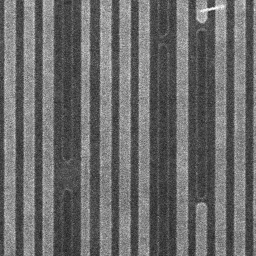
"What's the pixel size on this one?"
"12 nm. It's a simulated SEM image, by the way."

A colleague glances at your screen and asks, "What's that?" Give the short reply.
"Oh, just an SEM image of parallel lines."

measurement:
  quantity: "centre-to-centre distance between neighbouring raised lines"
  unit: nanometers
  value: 230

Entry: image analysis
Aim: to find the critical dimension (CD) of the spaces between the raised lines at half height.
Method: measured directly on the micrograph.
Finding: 0.112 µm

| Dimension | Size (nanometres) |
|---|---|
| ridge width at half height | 124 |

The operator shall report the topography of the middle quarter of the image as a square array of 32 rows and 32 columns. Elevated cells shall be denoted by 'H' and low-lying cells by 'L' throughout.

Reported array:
HHLLLHLLLHHHLLHHLLLHHLLLHHLLLHHL
HHLLLHLLLHHHLLHHLLLHHLLLHHLLLHHL
HHLLLHLLLHHHLLHHLLLHHLLLHHLLLHHL
HHLLLHLLLHHHLLHHLLLHHLLLHHLLLHHL
HHLLLHLLLHHHLLHHLLLHHLLLHHLLLHHL
HHLLLHLLLHHHLLHHLLLHHLLLHHLLLHHL
HHLLLHLLLHHHLLHHLLLHHLLLHHLLLHHL
HHLLHHLLLHHHLLHHLLLHHLLLHHLLHHHL
HHLLHHLLLHHHLLHHLLLHHLLLHHLLHHHL
HHLLHHLLLHHHLLHHLLLHHLLLHHLLHHHL
HHLLHHLLLHHHLLHHLLLHHLLLHHLLHHHL
HHLLHHLLLHHHLLHHLLLHHLLLHHLLHHHL
HHLLHHLLLHHHLLHHLLLHHLLLHHLLHHHL
HHLLHHLLLHHHLLHHLLLHHLLLHHLLHHHL
HHLLHHLLLHHHLLHHLLLHHLLLHHLLHHHL
HHLLHHLLLHHHLLHHLLLHHLLLHHLLHHHL
HHLLHHLLLHHHLLHHLLLHHLLLHHLLHHHL
HHLLHHLLLHHHLLHHLLLHHLLLHHLLHHHL
HHLLHHLLLHHHLLHHLLLHHLLLHHLLHHHL
HHLLHHLLLHHHLLHHLLLHHLLLHHLLHHHL
HHLLHHLLLHHHLLHHLLLHHLLLHHLLHHHL
HHLLHHLLLHHHLLHHLLLHHLLLHHLLHHHL
HHLLHHLLLHHHLLHHLLLHHLLLHHLLHHHL
HHLLHHLLLHHHLLHHLLLHHLLLHHLLHHHL
LLLLHHLLLHHHLLHHLLLHHLLLHHLLHHHL
LLLLHHLLLHHHLLHHLLLHHLLLHHLLHHHL
LLLLHHLLLHHHLLHHLLLHHLLLHHLLHHHL
LLLLHHLLLHHHLLHHLLLHHLLLHHLLHHHL
LLLLHHLLLHHHLLHHLLLHHLLLHHLLHHHL
LLLLHHLLLHHHLLHHLLLHHLLLHHLLHHHL
LLLLHHLLLHHHLLHHLLLHHLLLHHLLHHHL
HLLLHHLLLHHHLLHHLLLHHLLLHHLLHHHL